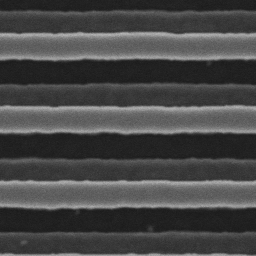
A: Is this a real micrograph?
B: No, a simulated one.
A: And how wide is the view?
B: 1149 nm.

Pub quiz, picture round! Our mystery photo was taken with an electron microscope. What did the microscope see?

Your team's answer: lines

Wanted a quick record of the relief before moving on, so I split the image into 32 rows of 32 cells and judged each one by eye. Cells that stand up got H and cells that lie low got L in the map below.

LLLLLLLLLLLLLLLLLLLLLLLLLLLLLLLL
LLLHHLLLLLLHHHHHHLHHLLLHLLHHHHHH
HHHHHHHHHHHHHHHHHHHHHHHHHHHHHHHH
HHHHHHHHHHHHHHHHHHHHHHHHHHHHHHHH
HHHHHHHHHHHHHHHHHHHHHHHHHHHHHHHH
HHHHHHHHHHHHHHHHHHHHHHHHHHHHHHHH
HHHHHHHHHHHHHHHHHHHHHHHHHHHHHHHH
LLLLLLHHLLLLLLLLLLLLLLLHHLLLLLLL
LLLLLLLLLLLLLLLLLLLLLLLLLLLLLLLL
LLLLLLLLLLLLLLLLLLLLLLLLLLLLLLLL
LLLLLLLLLLLLLLLLLLLLLLLLLLLLLLLL
HHHHHHHHHHHHHHHHHHHHHHHHHHHHHHHH
HHHHHHHHHHHHHHHHHHHHHHHHHHHHHHHH
HHHHHHHHHHHHHHHHHHHHHHHHHHHHHHHH
HHHHHHHHHHHHHHHHHHHHHHHHHHHHHHHH
HHHHHHHHHHHHHHHHHHHHHHHHHHHHHHHH
HHHHHHHLHHHHHHHHHHHHHHHHHHHHHHHH
LLLLLLLLLLLLLLLLLLLLLLLLLLLLLLLL
LLLLLLLLLLLLLLLLLLLLLLLLLLLLLLLL
LLLLLLLLLLLLLLLLLLLLLLLLLLLLLLLL
HHHHHHHHHHHHHHHHHHHHHHHHHHHHHHHH
HHHHHHHHHHHHHHHHHHHHHHHHHHHHHHHH
HHHHHHHHHHHHHHHHHHHHHHHHHHHHHHHH
HHHHHHHHHHHHHHHHHHHHHHHHHHHHHHHH
HHHHHHHHHHHHHHHHHHHHHHHHHHHHHHHH
HHHHHHHHHHHHHHHHHHHHHHHHHHHHHHHH
LLLLLLLLLLLLLLLLLLLLLLLLLLLLLLLL
LLLLLLLLLLLLLLLLLLLLLLLLLLLLLLLL
LLLLLLLLLLLLLLLLLLLLLLLLLLLLLLLL
HHHHHHHHHHHHHHHHHHHHHHHHHHHHHHHH
HHHHHHHHHHHHHHHHHHHHHHHHHHHHHHHH
HHHHHHHHHHHHHHHHHHHHHHHHHHHHHHHH